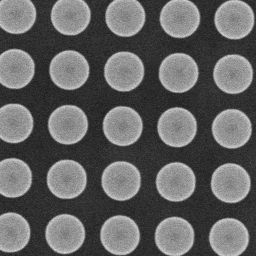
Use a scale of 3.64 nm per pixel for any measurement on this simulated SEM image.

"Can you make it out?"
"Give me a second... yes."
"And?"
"an array of small figures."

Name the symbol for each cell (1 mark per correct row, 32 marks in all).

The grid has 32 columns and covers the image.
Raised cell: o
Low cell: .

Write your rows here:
oooo...oooo...oooo...ooo....ooo.
oooo..ooooo..ooooo..ooooo..ooooo
oooo..ooooo..ooooo..ooooo..ooooo
oooo...oooo...oooo..ooooo..ooooo
.....................oo.....ooo.
................................
.oo.....o.......................
oooo...oooo...ooo...oooo...oooo.
oooo..ooooo..ooooo..ooooo..oooo.
oooo..ooooo..ooooo..ooooo..ooooo
ooo....ooo....ooo...oooo...oooo.
......................o.....oo..
................................
ooo....ooo....oo......o.........
oooo..ooooo..oooo...oooo...oooo.
oooo..ooooo..ooooo..ooooo..oooo.
oooo..ooooo..ooooo..oooo...oooo.
ooo....ooo....ooo...oooo...oooo.
............................o...
................................
ooo....ooo....oo.....oo.....o...
oooo..ooooo..oooo...oooo...oooo.
oooo..ooooo..oooo...oooo..ooooo.
oooo..ooooo..oooo...oooo..ooooo.
.o.....ooo....ooo...oooo...oooo.
................................
................................
ooo....ooo...oooo...ooo.....oo..
oooo..oooo...oooo...oooo..ooooo.
oooo..ooooo..oooo..ooooo..ooooo.
ooo...oooo...oooo...oooo..ooooo.
.......oo.....oo....ooo....ooo..